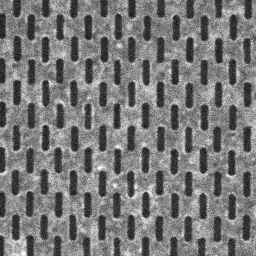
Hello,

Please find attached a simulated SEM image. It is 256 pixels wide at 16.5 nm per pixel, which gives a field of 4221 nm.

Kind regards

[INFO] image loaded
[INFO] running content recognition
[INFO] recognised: a regular array of holes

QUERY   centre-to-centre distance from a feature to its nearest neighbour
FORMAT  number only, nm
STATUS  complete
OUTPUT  427